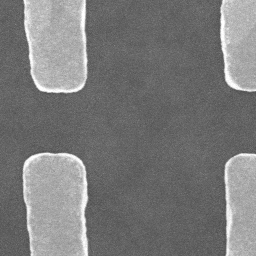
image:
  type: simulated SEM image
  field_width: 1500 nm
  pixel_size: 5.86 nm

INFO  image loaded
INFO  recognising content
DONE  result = raised bodies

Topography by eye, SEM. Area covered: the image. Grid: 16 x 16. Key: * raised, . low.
..***.........**
..***.........**
..***.........**
..***.........**
..***.........**
...**..........*
................
................
................
................
..***.........**
.****.........**
..***.........**
..***.........**
..***.........**
..***.........**